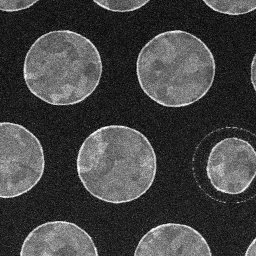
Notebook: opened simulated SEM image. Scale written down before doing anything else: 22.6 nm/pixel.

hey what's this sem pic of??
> raised bodies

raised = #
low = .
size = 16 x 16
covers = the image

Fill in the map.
##.....##....###
................
..###.....##....
..####...####...
..####...####...
..####...####...
..........##....
................
##....###.......
###..#####...###
###..#####...###
##...####....###
.......#........
................
..###....###....
.#####...####...